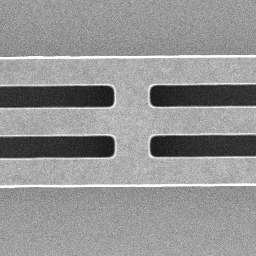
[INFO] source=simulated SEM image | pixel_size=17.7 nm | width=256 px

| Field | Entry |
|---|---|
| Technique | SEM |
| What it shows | groups of lines, slits or small figures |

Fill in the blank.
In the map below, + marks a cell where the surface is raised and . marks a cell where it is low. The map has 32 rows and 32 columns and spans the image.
................................
................................
................................
................................
................................
................................
................................
++++++++++++++++++++++++++++++++
++++++++++++++++++++++++++++++++
++++++++++++++++++++++++++++++++
+++++++++++++++++++++++++++++++.
..............+++++.............
..............+++++.............
..........++++++++++++++++++++++
++++++++++++++++++++++++++++++++
++++++++++++++++++++++++++++++++
++++++++++++++++++++++++++++++++
..............+++++.............
..............+++++.............
..............+++++.............
++++++++++++++++++++++++++++++++
++++++++++++++++++++++++++++++++
++++++++++++++++++++++++++++++++
................................
................................
................................
................................
................................
................................
................................
................................
................................